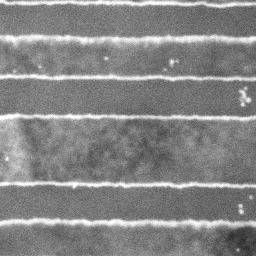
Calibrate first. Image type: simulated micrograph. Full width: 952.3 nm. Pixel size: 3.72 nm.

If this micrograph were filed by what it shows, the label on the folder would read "lines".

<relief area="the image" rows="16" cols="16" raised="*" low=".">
................
................
********.*******
****************
****************
................
................
****************
****************
****************
****************
**.*************
................
................
****************
****************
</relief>